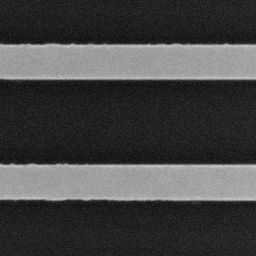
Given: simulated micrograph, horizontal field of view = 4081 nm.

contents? lines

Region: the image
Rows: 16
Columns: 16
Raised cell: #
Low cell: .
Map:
................
................
................
################
################
................
................
................
................
................
################
################
................
................
................
................